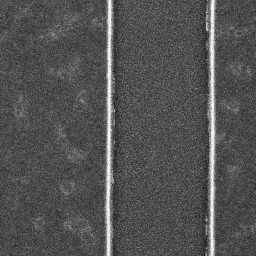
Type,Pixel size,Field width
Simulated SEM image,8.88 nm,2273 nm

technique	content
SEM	one or a few lines or trenches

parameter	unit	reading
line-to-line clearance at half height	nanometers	910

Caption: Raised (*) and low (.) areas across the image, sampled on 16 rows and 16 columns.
*******......***
*******......***
*******......***
*******......***
*******......***
*******......***
*******......***
*******......***
*******......***
*******......***
*******......***
*******......***
*******......***
*******......***
*******......***
*******......***